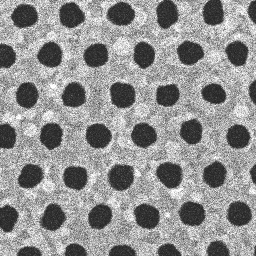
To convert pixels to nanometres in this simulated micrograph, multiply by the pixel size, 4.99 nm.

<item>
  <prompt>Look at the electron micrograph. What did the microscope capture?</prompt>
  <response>a regular array of holes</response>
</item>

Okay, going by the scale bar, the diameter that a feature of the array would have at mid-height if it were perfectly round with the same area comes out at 0.125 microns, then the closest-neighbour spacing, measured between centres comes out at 226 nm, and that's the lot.